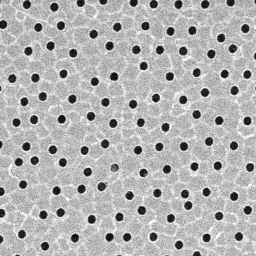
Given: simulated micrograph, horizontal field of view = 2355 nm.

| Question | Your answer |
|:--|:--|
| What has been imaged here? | a regular array of holes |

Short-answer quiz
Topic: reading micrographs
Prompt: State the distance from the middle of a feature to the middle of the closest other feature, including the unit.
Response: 195 nm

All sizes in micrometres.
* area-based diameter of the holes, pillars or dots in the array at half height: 0.0856